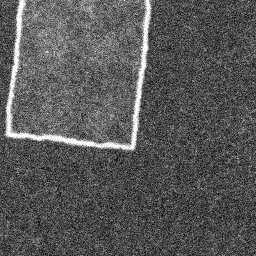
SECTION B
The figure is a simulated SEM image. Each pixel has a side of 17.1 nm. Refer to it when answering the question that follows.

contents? one or a few lines or trenches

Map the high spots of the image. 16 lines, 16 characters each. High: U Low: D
UDDDDDDDDUUUUUUU
UDDDDDDDDUUUUUUU
UDDDDDDDDUUUUUUU
UDDDDDDDDUUUUUUU
UDDDDDDDDUUUUUUU
UDDDDDDDDUUUUUUU
UDDDDDDDDUUUUUUU
UDDDDDDDUUUUUUUU
UUDDDDDDUUUUUUUU
UUUUUUUUUUUUUUUU
UUUUUUUUUUUUUUUU
UUUUUUUUUUUUUUUU
UUUUUUUUUUUUUUUU
UUUUUUUUUUUUUUUU
UUUUUUUUUUUUUUUU
UUUUUUUUUUUUUUUU